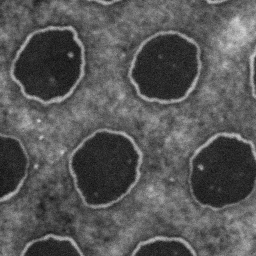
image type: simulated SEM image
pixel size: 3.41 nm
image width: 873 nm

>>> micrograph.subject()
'raised bodies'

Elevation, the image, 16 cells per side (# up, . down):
................
................
..###....###....
.####...#####...
.####...####....
.####...####....
................
................
#.....##.....##.
##...####...####
##..#####...####
#....###....####
.....##.....###.
................
................
..###....###....